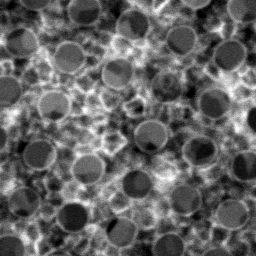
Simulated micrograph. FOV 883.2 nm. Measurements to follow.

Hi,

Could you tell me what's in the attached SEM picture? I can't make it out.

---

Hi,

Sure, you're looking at a regular array of raised bodies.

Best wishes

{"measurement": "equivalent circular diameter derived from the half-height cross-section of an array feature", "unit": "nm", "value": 110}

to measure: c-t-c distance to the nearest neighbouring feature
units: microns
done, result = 0.173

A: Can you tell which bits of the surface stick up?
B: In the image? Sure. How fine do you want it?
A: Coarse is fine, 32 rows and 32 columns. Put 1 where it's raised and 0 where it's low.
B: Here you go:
00011100011100000000000111000111
00000000011110001100000000000111
00000000011100011110000000000111
00100000000000011110001100000000
01110000000000011100011110000000
01111000110000000000011110001100
01110001110000000000001100011110
00000001111000110000000000011110
00000001110001111000000000011100
10000000000001111000000000000000
11100000000001110000000000000000
11100011000000000000000001110000
11000111100000000000000001111000
10000111100000001100000001111001
00000111000000000000000000110001
00000000000000000011000000000001
10000000001000000111100000000000
10000000000000000111100011000000
10011110000000000111000111100000
00011110001100000000000111100111
00011100011110000000000011110111
00000000011110001100000000100111
00000000011100011110000000000011
00110000000000011110001100000000
01111000000000001100011110000000
01111000110000000000011110111110
01110001111000000000001100011110
00000001111000110000000000011110
00000000110001111000000000001100
11000000000001111000110000000000
11100000000000110001111000000000
11100011000000000001111000111000